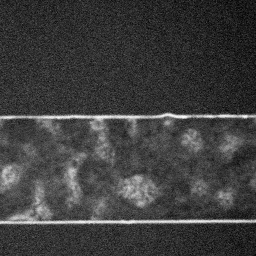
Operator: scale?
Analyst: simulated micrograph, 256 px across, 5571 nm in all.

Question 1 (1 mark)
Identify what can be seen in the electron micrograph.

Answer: one or a few lines or trenches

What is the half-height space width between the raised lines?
2270 nanometres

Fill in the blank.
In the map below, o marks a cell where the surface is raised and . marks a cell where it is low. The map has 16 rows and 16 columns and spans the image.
oooooooooooooooo
oooooooooooooooo
oooooooooooooooo
oooooooooooooooo
oooooooooooooooo
oooooooooooooooo
oooooooooooooooo
................
................
................
................
................
................
................
oooooooooooooooo
oooooooooooooooo